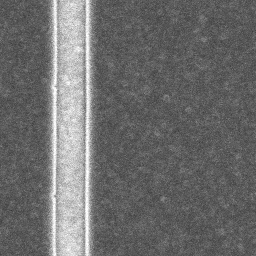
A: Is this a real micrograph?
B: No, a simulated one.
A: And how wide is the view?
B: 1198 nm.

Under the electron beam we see one or a few lines or trenches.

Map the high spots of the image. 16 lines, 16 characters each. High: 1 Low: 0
1110011111111111
1110011111111111
1110011111111111
1110011111111111
1110011111111111
1110011111111111
1110011111111111
1110011111111111
1110011111111111
1110011111111111
1110011111111111
1110011111111111
1110011111111111
1110011111111111
1110011111111111
1110011111111111